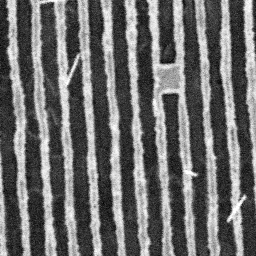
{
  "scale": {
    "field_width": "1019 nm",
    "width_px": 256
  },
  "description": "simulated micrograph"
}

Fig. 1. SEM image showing parallel lines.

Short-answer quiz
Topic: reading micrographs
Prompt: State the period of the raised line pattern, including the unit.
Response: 93.9 nm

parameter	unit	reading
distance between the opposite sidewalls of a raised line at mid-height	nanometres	27.8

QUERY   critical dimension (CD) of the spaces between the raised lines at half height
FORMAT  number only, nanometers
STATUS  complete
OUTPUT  67.5